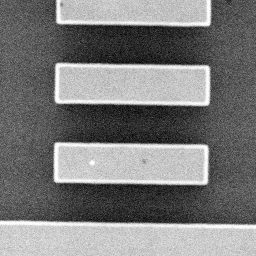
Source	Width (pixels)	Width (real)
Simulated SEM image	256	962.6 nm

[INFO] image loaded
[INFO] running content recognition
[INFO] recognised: groups of lines, slits or small figures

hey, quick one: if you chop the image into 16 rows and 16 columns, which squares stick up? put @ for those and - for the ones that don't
----@@@@@@@@@---
----------@@@---
----------------
----------------
----@@@@@@@@@---
----@@@@@@@@@---
----------------
----------------
----------------
---@@@@@@@@@@---
---@@@@@@@@@@---
----------------
----------------
----------------
@@@@@@@@@@@@@@@@
@@@@@@@@@@@@@@@@